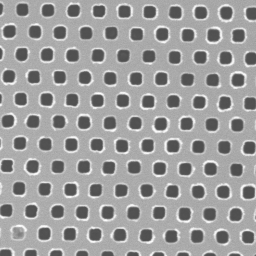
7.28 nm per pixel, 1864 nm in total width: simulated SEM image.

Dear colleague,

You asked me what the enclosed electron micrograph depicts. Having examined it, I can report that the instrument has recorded a regular array of holes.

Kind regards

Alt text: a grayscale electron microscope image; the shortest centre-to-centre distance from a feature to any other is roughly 183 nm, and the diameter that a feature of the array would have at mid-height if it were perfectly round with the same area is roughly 95.1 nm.